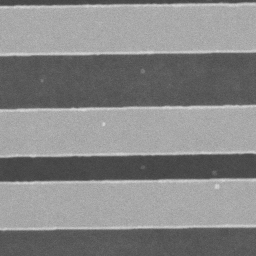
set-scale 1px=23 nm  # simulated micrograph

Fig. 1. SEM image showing lines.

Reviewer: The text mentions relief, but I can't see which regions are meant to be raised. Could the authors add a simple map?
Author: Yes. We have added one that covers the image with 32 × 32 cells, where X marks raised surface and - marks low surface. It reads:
---------------------XXXXXXXXXXX
XXXXXXXXXXXXXXXXXXXXXXXXXXXXXXXX
XXXXXXXXXXXXXXXXXXXXXXXXXXXXXXXX
XXXXXXXXXXXXXXXXXXXXXXXXXXXXXXXX
XXXXXXXXXXXXXXXXXXXXXXXXXXXXXXXX
XXXXXXXXXXXXXXXXXXXXXXXXXXXXXXXX
XXXXXXXXXXXXXXXXXXXXXXXXXXXXXXXX
--------------------------------
--------------------------------
--------------------------------
--------------------------------
--------------------------------
--------------------------------
---------------XXXXXXXXXXXXXXXXX
XXXXXXXXXXXXXXXXXXXXXXXXXXXXXXXX
XXXXXXXXXXXXXXXXXXXXXXXXXXXXXXXX
XXXXXXXXXXXXXXXXXXXXXXXXXXXXXXXX
XXXXXXXXXXXXXXXXXXXXXXXXXXXXXXXX
XXXXXXXXXXXXXXXXXXXXXXXXXXXXXXXX
XXXXXXXXX-XX--------------------
--------------------------------
--------------------------------
--------------------XXXXXXXXXXXX
XXXXXXXXXXXXXXXXXXXXXXXXXXXXXXXX
XXXXXXXXXXXXXXXXXXXXXXXXXXXXXXXX
XXXXXXXXXXXXXXXXXXXXXXXXXXXXXXXX
XXXXXXXXXXXXXXXXXXXXXXXXXXXXXXXX
XXXXXXXXXXXXXXXXXXXXXXXXXXXXXXXX
XXXXXXXXXXXXXXXX----------------
--------------------------------
--------------------------------
--------------------------------